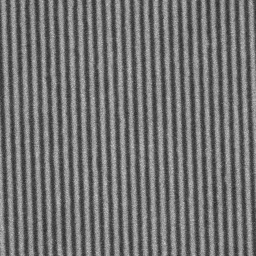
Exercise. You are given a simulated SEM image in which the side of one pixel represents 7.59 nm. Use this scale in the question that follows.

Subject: parallel lines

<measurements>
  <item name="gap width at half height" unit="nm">42.6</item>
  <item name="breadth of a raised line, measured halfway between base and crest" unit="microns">0.0284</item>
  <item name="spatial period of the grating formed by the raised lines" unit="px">9.51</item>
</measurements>